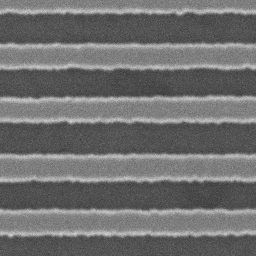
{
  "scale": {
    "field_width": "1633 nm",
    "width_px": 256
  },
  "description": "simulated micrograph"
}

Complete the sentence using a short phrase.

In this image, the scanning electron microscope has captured lines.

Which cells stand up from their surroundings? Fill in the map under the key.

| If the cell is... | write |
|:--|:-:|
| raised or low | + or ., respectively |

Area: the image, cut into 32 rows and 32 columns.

++++++++++++++++++++++++++++++++
+++++++++++++++++++++++.++++.+++
................................
................................
................................
.+....++..++....+......++..+++..
++++++++++++++++++++++++++++++++
++++++++++++++++++++++++++++++++
+++++++++.+++++.++++++++...+++++
................................
................................
................................
++++++++++++++++++++++++++++++++
++++++++++++++++++++++++++++++++
++++++++++++++++++++++++++++++++
................................
................................
................................
................................
++++++++++++++++++++++++++++++++
++++++++++++++++++++++++++++++++
++++++++++++++++++++++++++++++++
++++.+++.+++++++.+++.+++++++++++
................................
................................
................................
++++++++++++++++++++++++++++++++
++++++++++++++++++++++++++++++++
++++++++++++++++++++++++++++++++
.+...................+..........
................................
................................